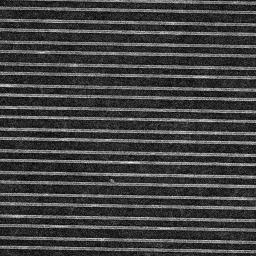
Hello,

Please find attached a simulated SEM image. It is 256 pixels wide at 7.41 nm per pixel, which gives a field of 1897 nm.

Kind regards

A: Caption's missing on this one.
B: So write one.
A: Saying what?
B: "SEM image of parallel lines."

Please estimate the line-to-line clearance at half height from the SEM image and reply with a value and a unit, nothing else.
51.9 nm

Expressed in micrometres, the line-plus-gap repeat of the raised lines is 0.0804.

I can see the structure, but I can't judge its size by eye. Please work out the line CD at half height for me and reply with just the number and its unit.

18.5 nanometres